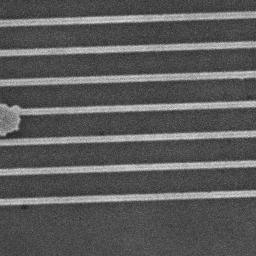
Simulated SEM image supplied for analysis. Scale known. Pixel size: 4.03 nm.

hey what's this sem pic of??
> parallel lines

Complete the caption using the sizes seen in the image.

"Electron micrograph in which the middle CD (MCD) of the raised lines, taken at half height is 20.6 nm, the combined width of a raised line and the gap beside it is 120 nm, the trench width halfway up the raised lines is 99.7 nm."